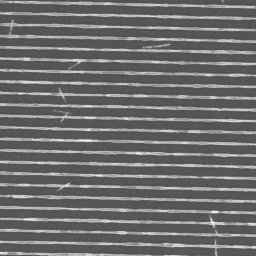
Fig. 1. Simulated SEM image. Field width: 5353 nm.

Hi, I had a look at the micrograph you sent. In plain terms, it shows parallel lines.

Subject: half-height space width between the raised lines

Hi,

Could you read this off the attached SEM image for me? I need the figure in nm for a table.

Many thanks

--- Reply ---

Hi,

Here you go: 201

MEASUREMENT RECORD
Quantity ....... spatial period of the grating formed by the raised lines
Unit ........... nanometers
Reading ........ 239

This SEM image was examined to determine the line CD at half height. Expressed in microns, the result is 0.034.